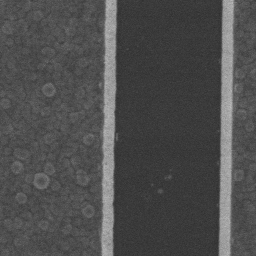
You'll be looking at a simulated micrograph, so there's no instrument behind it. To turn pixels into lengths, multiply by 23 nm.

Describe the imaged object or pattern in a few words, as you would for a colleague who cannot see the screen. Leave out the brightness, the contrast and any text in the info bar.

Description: one or a few lines or trenches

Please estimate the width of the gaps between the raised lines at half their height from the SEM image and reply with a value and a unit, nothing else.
2670 nm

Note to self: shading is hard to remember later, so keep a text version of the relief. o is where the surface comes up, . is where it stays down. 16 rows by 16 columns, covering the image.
ooooooo.......oo
ooooooo.......oo
ooooooo.......oo
ooooooo.......oo
ooooooo.......oo
ooooooo.......oo
ooooooo.......oo
ooooooo.......oo
ooooooo.......oo
ooooooo.......oo
ooooooo.......oo
ooooooo.......oo
ooooooo.......oo
ooooooo.......oo
ooooooo.......oo
ooooooo.......oo